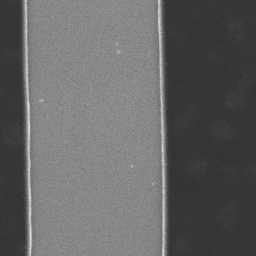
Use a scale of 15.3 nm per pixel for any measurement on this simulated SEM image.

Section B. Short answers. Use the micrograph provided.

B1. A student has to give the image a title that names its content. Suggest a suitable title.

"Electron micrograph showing one or a few lines or trenches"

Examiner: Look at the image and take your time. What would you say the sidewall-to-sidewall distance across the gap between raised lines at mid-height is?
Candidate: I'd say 2030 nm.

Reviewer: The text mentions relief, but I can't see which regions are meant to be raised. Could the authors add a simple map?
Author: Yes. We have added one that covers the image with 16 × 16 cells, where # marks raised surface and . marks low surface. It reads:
##........######
##........######
##........######
##........######
##........######
##........######
##........######
##........######
##........######
##........######
##........######
##........######
##........######
##........######
##........######
##........######